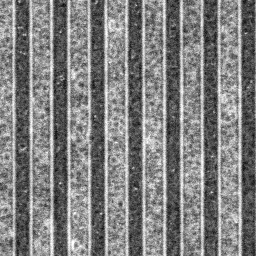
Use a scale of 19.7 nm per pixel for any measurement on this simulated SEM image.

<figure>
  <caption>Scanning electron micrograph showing parallel lines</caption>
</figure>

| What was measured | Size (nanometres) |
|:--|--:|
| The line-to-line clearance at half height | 321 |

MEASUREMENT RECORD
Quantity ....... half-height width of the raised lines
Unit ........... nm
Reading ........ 415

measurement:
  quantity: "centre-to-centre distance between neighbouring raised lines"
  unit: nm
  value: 743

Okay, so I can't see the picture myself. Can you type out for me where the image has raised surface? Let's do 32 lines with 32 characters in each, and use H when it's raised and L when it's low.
HHLLHHLLLHHLLHHHLLHHLLLHHLLHHHLL
HHLLHHLLLHHLLHHHLLHHLLLHHLLHHHLL
HHLLHHLLLHHLLHHHLLHHLLLHHLLHHHLL
HHLLHHLLLHHLLHHHLLHHLLLHHLLHHHLL
HHLLHHLLLHHLLHHHLLHHLLLHHLLHHHLL
HHLLHHLLLHHLLHHHLLHHLLLHHLLHHHLL
HHLLHHLLLHHLLHHHLLHHLLLHHLLHHHLL
HHLLHHLLLHHLLHHHLLHHLLLHHLLHHHLL
HHLLHHLLLHHLLHHHLLHHLLLHHLLHHHLL
HHLLHHLLLHHLLHHHLLHHLLLHHLLHHHLL
HHLLHHLLLHHLLHHHLLHHLLLHHLLHHHLL
HHLLHHLLLHHLLHHHLLHHLLLHHLLHHHLL
HHLLHHLLLHHLLHHHLLHHLLLHHLLHHHLL
HHLLHHLLLHHLLHHHLLHHLLLHHLLHHHLL
HHLLHHLLLHHLLHHHLLHHLLLHHLLHHHLL
HHLLHHLLLHHLLHHHLLHHLLLHHLLHHHLL
HHLLHHLLLHHLLHHHLLHHLLLHHLLHHHLL
HHLLHHLLLHHLLHHHLLHHLLLHHLLHHHLL
HHLLHHLLLHHLLHHHLLHHLLLHHLLHHHLL
HHLLHHLLLHHLLHHHLLHHLLLHHLLHHHLL
HHLLHHLLLHHLLHHHLLHHHLLHHLLHHHLL
HHLLHHLLLHHLLHHHLLHHHLLHHLLHHHLL
HHLLHHLLLHHLLHHHLLHHHLLHHLLHHHLL
HHLLHHLLLHHLLHHHLLHHHLLHHLLHHHLL
HHLLHHLLLHHLLHHHLLHHHLLHHLLHHHLL
HHLLHHLLLHHLLHHHLLHHHLLHHLLHHHLL
HHLLHHLLLHHLLHHHLLHHHLLHHLLHHHLL
HHLLHHLLLHHLLHHHLLHHHLLHHLLHHHLL
HHLLHHLLLHHLLHHHLLHHHLLHHLLHHHLL
HHLLHHLLLHHLLHHHLLHHHLLHHLLHHHLL
HHLLHHLLLHHLLHHHLLHHHLLHHLLHHHLL
HHLLHHLLLHHLLHHHLLHHHLLHHLLHHHLL